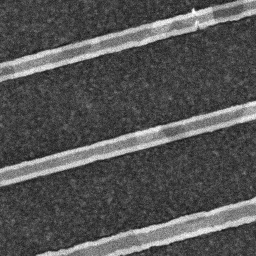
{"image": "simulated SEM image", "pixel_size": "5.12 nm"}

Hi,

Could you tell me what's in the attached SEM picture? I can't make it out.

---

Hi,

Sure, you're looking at one or a few lines or trenches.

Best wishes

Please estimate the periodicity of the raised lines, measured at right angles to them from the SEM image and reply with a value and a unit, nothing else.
511 nm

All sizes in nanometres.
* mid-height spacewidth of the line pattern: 443